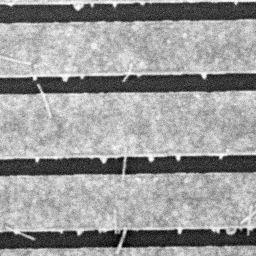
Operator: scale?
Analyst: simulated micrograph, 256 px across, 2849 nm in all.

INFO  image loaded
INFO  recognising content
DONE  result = lines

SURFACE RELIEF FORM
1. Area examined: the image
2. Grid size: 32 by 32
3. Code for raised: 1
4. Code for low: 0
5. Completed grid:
01000000000000000000000000000000
00000000000000000000000000000000
00000000000000000000000000000000
11111111111111111111111111111111
11111111111111111111111111111111
11111111111111111111111111111111
11111111111111111111111111111111
11111111111111111111111111111111
11111111111111111111111111111111
11110000000000000000000000000000
00000000000000000000000000000000
00000000000000000000000000001111
11111111111111111111111111111111
11111111111111111111111111111111
11111111111111111111111111111111
11111111111111111111111111111111
11111111111111111111111111111111
11111111111111111111111111111111
11111111111111111111111111111111
11111111111111110000000000000000
00000000000000000000000000000000
00000000000000000000000000000000
11111111111111111111111111111111
11111111111111111111111111111111
11111111111111111111111111111111
11111111111111111111111111111111
11111111111111111111111111111111
11111111111111111111111111111111
11111111111111111111111111111011
00000000000000000000000000000000
00000000000000000000000000000000
11111111111111111111111111111111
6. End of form